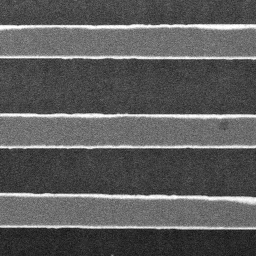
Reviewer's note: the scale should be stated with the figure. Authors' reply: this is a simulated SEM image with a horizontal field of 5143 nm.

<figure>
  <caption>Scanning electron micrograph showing lines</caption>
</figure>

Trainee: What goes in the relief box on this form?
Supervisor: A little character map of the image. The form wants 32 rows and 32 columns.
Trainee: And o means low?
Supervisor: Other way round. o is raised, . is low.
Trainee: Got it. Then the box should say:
................................
................................
................................
oooooooooooooooooooooooooooooooo
oooooooooooooooooooooooooooooooo
oooooooooooooooooooooooooooooooo
oooooooooooooooooooooooooooooooo
................................
................................
................................
................................
................................
................................
................................
oooooooooooooooooooooooooooooooo
oooooooooooooooooooooooooooooooo
oooooooooooooooooooooooooooooooo
oooooooooooooooooooooooooooooooo
...........o....................
................................
................................
................................
................................
................................
ooooooooooooooo.................
oooooooooooooooooooooooooooooooo
oooooooooooooooooooooooooooooooo
oooooooooooooooooooooooooooooooo
...................o..oooooooooo
................................
................................
................................